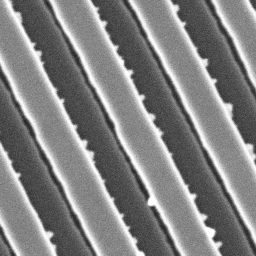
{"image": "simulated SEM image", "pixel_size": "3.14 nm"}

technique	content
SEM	lines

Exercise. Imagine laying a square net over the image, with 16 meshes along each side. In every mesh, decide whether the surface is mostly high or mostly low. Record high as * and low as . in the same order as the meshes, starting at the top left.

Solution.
*..***..***...**
*...**...**...**
**..***..***...*
**...**...**...*
***..***..***...
.**...**...**...
.***..***..***..
..**...**...**..
..***..***..***.
...**...***..***
*..***...**...**
*...**...***..**
**..***..***...*
**...***..***..*
***..***...**...
.**...***..***..